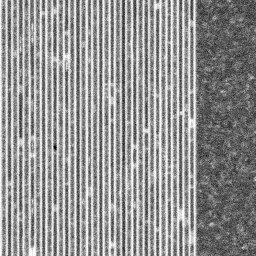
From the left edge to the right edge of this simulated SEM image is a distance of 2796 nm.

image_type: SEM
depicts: parallel lines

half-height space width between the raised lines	0.0464	micrometres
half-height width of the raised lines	73.7	nm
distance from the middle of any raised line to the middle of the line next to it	0.125	um